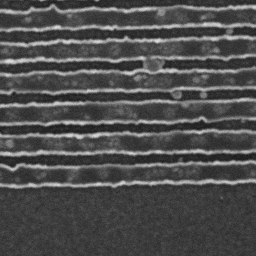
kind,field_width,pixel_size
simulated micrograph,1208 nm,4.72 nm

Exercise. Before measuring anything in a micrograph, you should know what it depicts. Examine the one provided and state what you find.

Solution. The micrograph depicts parallel lines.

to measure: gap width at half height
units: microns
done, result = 0.046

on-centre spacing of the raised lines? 147 nanometers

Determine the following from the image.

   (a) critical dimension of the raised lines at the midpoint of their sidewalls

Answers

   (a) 101 nm